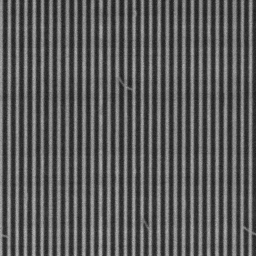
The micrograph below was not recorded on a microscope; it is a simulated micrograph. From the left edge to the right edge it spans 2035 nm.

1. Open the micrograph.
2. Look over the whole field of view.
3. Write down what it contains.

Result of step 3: parallel lines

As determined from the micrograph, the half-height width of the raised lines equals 28.8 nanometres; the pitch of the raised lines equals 66.1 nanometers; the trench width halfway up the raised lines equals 0.0437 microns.